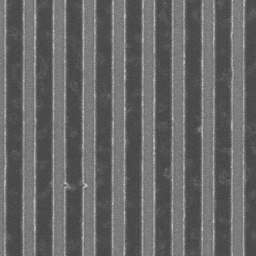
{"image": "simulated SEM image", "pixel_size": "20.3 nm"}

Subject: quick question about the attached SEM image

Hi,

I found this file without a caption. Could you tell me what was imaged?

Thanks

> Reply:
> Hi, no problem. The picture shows parallel lines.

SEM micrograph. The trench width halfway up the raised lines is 211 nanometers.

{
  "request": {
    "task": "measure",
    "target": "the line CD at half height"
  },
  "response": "0.397 um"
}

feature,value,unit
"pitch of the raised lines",0.605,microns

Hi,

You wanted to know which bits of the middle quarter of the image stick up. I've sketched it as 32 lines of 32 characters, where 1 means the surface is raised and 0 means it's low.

11111000111100011111000111100011
11111000111100011111000111100011
11111000111100011111000111100011
11111000111100011111000111100011
11111000111100011111000111100011
11111000111100011111000111100011
11111000111100011111000111100011
11111000111100011111000111100011
11111000111100011111000111100011
11111000111100011111000111100011
11111000111100011111000111100011
11111000111100011111000111100011
11111000111100011111000111100011
11111000111100011111000111100011
11111000111100011111001111100011
11111000111100011111001111100011
11111000111100011111001111100011
11111000111100011111001111100011
11111000111100011111001111100011
11111000111100011111001111100011
11111000111100011111001111100011
11111000111100011111001111100011
11111000111100011111001111100011
11111000111100011111001111100011
11111000111100011111001111100011
11111000111100011111000111100011
11111000111100011111000111100011
11111000111100011111000111100011
11111000111100011111000111100011
11111000111100011111000111100011
01111100111100011111000111100011
11111000111100011111000111100011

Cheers